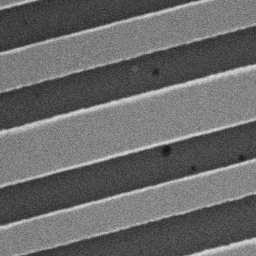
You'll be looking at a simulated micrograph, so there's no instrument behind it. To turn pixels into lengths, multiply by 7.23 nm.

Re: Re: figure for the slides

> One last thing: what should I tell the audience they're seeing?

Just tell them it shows lines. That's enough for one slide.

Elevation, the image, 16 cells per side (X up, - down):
-----------XXXXX
-------XXXXXXXXX
---XXXXXXXXX----
XXXXXXXXX-------
XXXXX---------XX
X----------XXXXX
-------XXXXXXXXX
---XXXXXXXXXXXXX
XXXXXXXXXXXX----
XXXXXXXX--------
XXXXX---------XX
X---------XXXXXX
------XXXXXXXXX-
---XXXXXXXX-----
XXXXXXX---------
XXX-----------XX